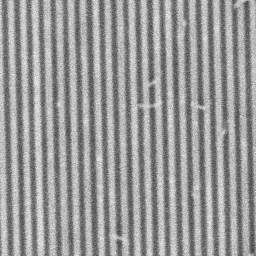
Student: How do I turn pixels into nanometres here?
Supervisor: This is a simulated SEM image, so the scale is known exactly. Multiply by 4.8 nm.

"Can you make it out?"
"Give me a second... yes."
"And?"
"parallel lines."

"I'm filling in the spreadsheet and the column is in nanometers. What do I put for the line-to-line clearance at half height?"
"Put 33.6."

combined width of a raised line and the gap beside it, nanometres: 58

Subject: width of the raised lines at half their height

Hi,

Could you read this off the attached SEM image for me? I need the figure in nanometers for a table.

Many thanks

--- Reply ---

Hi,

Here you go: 24